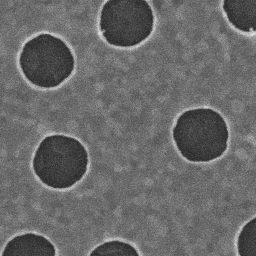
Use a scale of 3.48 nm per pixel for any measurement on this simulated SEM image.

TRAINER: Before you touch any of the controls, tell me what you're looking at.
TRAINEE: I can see holes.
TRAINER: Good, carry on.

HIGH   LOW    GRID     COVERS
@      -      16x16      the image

@@@@@@---@@@@@--
@@@@@@----@@@@--
@@--@@@--@@@@@@@
@----@@@@@@@@@@@
@----@@@@@@@@@@@
@@@@@@@@@@@@@@@@
@@@@@@@@@@@@@@@@
@@@@@@@@@@@---@@
@@@-@@@@@@@---@@
@@---@@@@@@---@@
@@---@@@@@@@@@@@
@@@--@@@@@@@@@@@
@@@@@@@@@@@@@@@@
@@@@@@@@@@@@@@@@
@@@@@@@@@@@@@@@-
---@@@--@@@@@@@-